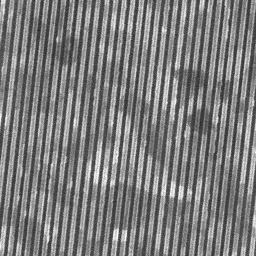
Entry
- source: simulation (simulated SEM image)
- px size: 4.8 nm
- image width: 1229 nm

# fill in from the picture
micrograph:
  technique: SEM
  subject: parallel lines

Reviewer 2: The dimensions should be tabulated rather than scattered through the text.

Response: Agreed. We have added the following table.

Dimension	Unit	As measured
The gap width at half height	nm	18.5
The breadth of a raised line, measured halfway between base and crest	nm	22.7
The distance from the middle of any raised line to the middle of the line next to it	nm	41.3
